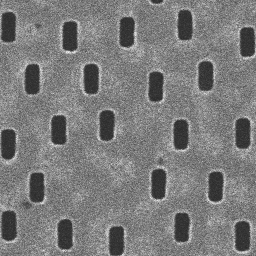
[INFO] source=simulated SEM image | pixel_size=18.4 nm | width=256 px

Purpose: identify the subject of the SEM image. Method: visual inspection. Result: a regular array of holes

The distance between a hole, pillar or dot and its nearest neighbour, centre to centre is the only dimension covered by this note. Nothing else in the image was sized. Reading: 960 nanometres